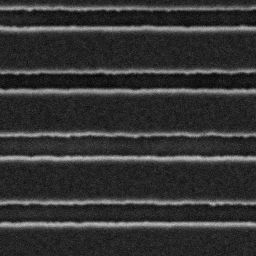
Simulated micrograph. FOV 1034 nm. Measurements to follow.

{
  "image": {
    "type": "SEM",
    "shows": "lines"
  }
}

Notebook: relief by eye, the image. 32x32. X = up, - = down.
XXXXXXXXXXXXXXXXXXXXXXXXXXXXXXXX
--------------------------------
--------------------------------
X-------XX-----XXXXX----------X-
XXXXXXXXXXXXXXXXXXXXXXXXXXXXXXXX
XXXXXXXXXXXXXXXXXXXXXXXXXXXXXXXX
XXXXXXXXXXXXXXXXXXXXXXXXXXXXXXXX
XXXXXXXXXXXXXXXXXXXXXXXXXXXXXXXX
XXXXXXXXXXXXXXXXXXXXXXXXXXXXXXXX
--------------------------------
--------------------------------
XXXXXXXXXXXXXXXXXXXXXXXXXXXXXXXX
XXXXXXXXXXXXXXXXXXXXXXXXXXXXXXXX
XXXXXXXXXXXXXXXXXXXXXXXXXXXXXXXX
XXXXXXXXXXXXXXXXXXXXXXXXXXXXXXXX
XXXXXXXXXXXXXXXXXXXXXXXXXXXXXXXX
XXXXXXXXXXXXXXXXXXXXXXXXXXXXXXXX
--------------------------------
--------------------------------
--------------------------------
XXXXXXXXXXXXXXXXXXXXXXXXXXXXXXXX
XXXXXXXXXXXXXXXXXXXXXXXXXXXXXXXX
XXXXXXXXXXXXXXXXXXXXXXXXXXXXXXXX
XXXXXXXXXXXXXXXXXXXXXXXXXXXXXXXX
XXXXXXXXXXXXXXXXXXXXXXXXXXXXXXXX
X--X-XXXX-X--------XXXX---XXX-XX
--------------------------------
--------------------------------
XXXXXXXXXXXXXXXXXXXXXXXXXXXXXXXX
XXXXXXXXXXXXXXXXXXXXXXXXXXXXXXXX
XXXXXXXXXXXXXXXXXXXXXXXXXXXXXXXX
XXXXXXXXXXXXXXXXXXXXXXXXXXXXXXXX